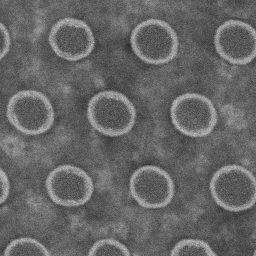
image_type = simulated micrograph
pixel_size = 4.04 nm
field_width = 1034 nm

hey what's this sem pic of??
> raised bodies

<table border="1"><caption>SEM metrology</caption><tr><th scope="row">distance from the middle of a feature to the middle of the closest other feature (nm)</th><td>330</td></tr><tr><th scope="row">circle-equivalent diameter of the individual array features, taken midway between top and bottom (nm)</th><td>163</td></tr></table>